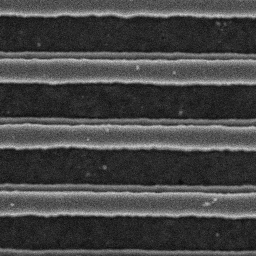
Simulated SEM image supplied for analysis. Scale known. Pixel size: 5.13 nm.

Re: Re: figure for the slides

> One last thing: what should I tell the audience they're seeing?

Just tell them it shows lines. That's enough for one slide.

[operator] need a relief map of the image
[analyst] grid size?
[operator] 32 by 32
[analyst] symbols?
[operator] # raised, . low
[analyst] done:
################################
################################
................................
................................
................................
................................
................................
#####################.####.#####
################################
################################
....................####.#.##.##
................................
................................
................................
................................
...#............................
################################
################################
..#................#############
................................
................................
................................
................................
................................
################################
################################
################################
................................
................................
................................
................................
................................